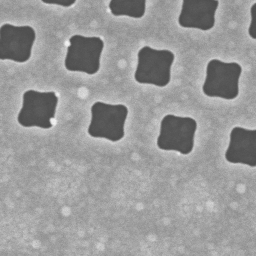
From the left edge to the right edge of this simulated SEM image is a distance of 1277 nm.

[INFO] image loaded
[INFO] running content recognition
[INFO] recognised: holes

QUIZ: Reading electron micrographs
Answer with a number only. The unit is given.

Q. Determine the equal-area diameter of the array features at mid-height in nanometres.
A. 196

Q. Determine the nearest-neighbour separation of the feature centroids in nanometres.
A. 351